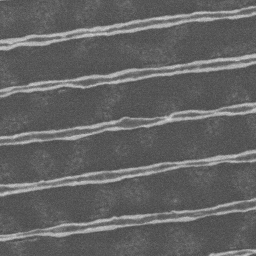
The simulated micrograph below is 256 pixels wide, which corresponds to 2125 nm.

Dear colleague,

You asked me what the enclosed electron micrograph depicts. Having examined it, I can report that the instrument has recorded parallel lines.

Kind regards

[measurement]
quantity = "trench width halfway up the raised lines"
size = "330 nm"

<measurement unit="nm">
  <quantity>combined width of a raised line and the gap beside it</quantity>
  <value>399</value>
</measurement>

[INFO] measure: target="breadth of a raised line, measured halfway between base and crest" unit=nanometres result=66.9